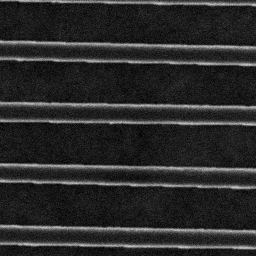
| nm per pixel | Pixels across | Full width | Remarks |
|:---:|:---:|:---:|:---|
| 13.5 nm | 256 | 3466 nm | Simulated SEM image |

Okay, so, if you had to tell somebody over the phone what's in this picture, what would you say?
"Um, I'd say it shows lines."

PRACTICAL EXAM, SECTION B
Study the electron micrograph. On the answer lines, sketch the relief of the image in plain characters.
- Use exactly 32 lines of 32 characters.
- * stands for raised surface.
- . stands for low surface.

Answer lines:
..........................******
................................
................................
................................
................................
***********.....................
********************************
......**************************
................................
................................
................................
................................
................................
********************************
********************************
...............................*
................................
................................
................................
................................
................................
********************************
********************************
................................
................................
................................
................................
................................
**********......................
********************************
********************************
................................